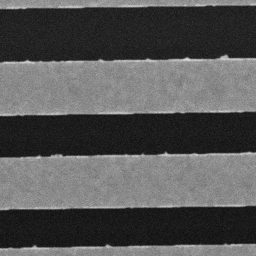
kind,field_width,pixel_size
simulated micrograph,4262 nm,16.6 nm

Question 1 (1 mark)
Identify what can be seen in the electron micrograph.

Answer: lines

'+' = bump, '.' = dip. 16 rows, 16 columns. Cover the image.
++..............
................
................
................
++++++++++++++++
++++++++++++++++
++++++++++++++++
................
................
................
++++++++++++++++
++++++++++++++++
++++++++++++++++
................
................
....++++++++++++